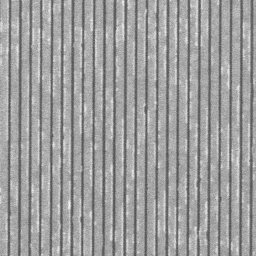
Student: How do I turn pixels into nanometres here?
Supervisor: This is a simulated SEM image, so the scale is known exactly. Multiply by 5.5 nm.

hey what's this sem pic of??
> parallel lines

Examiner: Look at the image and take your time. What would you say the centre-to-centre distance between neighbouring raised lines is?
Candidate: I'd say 57.9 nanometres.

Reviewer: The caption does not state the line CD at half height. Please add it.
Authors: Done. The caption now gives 0.0398 um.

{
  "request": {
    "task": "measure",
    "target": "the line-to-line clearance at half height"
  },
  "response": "15.1 nanometers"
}